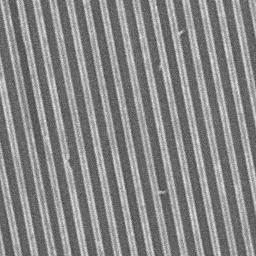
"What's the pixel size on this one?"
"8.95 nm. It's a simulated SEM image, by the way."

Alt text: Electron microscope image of parallel lines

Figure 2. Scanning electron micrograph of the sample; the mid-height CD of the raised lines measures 50.5 nm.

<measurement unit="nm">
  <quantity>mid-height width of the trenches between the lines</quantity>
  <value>93.4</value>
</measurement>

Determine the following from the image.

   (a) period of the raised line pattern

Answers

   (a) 0.146 um